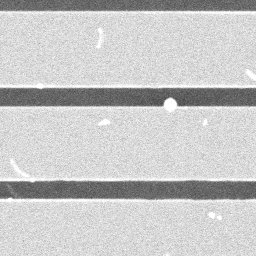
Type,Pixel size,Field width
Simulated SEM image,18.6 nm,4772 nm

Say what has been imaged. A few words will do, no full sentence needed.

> lines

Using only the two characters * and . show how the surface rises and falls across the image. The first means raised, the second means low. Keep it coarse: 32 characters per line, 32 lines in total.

................................
................................
********************************
********************************
********************************
********************************
********************************
********************************
********************************
********************************
********************************
................................
.....................*..........
********************************
********************************
********************************
********************************
********************************
********************************
********************************
********************************
********************************
********************************
................................
................................
********************************
********************************
********************************
********************************
********************************
********************************
********************************